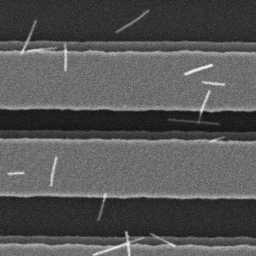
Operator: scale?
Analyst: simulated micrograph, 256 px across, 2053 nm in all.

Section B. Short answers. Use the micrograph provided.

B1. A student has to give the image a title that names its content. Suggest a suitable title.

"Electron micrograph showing lines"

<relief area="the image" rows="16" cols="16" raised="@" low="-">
----------------
----------------
----------------
@@@@@@@@@@@@@@@@
@@@@@@@@@@@@@@@@
@@@@@@@@@@@@@@@@
@@@@@@@@@@@@@@@@
----------------
----------------
@@@@@@@@@@@@@@@@
@@@@@@@@@@@@@@@@
@@@@@@@@@@@@@@@@
----------------
----------------
----------------
@@@@@@@@@@@@@@@@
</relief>